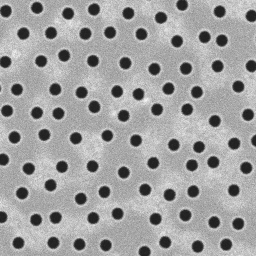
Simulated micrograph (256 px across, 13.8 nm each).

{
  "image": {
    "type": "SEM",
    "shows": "a regular array of holes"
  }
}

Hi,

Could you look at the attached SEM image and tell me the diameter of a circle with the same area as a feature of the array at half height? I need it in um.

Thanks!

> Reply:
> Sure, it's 0.174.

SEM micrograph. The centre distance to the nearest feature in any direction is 25.1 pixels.